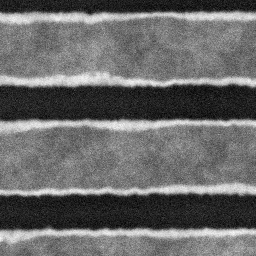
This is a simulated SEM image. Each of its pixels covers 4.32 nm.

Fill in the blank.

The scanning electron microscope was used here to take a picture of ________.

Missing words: lines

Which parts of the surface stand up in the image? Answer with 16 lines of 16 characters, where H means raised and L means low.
LLLLLLLLLLLLLLLL
HHHHHHHHHHHHHHHH
HHHHHHHHHHHHHHHH
HHHHHHHHHHHHHHHH
HHHHHHHHHHHHHHHH
LLLLLLLLLLLLLLLL
LLLLLLLLLLLLLLLL
LLLLLLLLLLLLLLLL
HHHHHHHHHHHHHHHH
HHHHHHHHHHHHHHHH
HHHHHHHHHHHHHHHH
HHHHHHHHHHHHHHHH
LLLLLLLLLLLLLLLL
LLLLLLLLLLLLLLLL
HHHHHHHHHHHHHHHH
HHHHHHHHHHHHHHHH